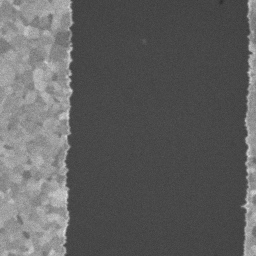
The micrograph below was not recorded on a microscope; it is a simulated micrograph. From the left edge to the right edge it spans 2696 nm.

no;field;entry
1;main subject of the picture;one or a few lines or trenches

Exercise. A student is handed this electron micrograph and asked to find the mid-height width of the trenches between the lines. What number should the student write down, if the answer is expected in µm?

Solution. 1.9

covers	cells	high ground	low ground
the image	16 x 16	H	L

HHHHLLLLLLLLLLLL
HHHHLLLLLLLLLLLL
HHHHLLLLLLLLLLLL
HHHHLLLLLLLLLLLL
HHHHLLLLLLLLLLLL
HHHHLLLLLLLLLLLL
HHHHLLLLLLLLLLLH
HHHHLLLLLLLLLLLH
HHHHLLLLLLLLLLLH
HHHHLLLLLLLLLLLL
HHHHLLLLLLLLLLLH
HHHHLLLLLLLLLLLL
HHHHLLLLLLLLLLLH
HHHHLLLLLLLLLLLH
HHHHLLLLLLLLLLLH
HHHHLLLLLLLLLLLH